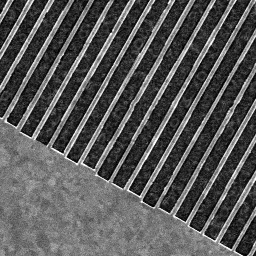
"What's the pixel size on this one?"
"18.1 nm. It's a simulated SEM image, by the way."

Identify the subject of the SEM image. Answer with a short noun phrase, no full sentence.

parallel lines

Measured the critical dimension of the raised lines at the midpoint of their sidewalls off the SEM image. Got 72.8 nanometers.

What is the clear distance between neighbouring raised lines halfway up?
0.254 µm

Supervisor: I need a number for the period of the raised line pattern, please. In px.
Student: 17.6